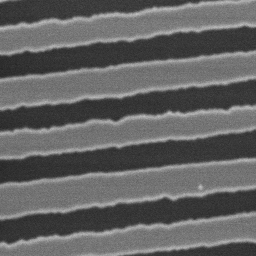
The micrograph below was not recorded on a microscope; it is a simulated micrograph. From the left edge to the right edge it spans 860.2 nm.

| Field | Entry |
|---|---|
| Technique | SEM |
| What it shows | lines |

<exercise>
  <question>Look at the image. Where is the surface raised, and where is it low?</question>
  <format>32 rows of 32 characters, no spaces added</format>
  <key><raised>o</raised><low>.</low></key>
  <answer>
.........................ooooooo
..................oooooooooooooo
......o..ooooooooooooooooooooooo
oooooooooooooooooooooooooooo....
ooooooooooooooooooo.............
ooooooooooo.....................
ooo............................o
.....................ooooooooooo
.............ooooooooooooooooooo
...ooooooooooooooooooooooooooooo
oooooooooooooooooooooooooo......
ooooooooooooooooo...............
oooooooooo......................
oo...........................ooo
.................oo.oooooooooooo
..........oooooooooooooooooooooo
ooooooooooooooooooooooooooooo...
ooooooooooooooooooooo...........
ooooooooooooo...................
oooo............................
.........................ooooooo
...............ooooooooooooooooo
.....ooooooooooooooooooooooooooo
oooooooooooooooooooooooooooooooo
oooooooooooooooooooooooo........
oooooooooooooo..................
ooooooo.........................
.........................ooooooo
................oooooooooooooooo
.........ooooooooooooooooooooooo
o.oooooooooooooooooooooooooo....
ooooooooooooooooooo.............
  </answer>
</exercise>